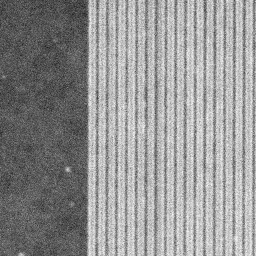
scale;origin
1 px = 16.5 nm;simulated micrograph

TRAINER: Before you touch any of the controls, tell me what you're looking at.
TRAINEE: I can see parallel lines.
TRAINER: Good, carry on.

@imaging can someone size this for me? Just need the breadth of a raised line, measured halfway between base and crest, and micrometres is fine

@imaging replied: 0.0908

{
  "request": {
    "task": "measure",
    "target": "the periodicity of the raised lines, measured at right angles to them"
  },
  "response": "162 nm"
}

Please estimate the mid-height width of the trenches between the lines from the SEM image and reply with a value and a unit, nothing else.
0.0743 micrometres